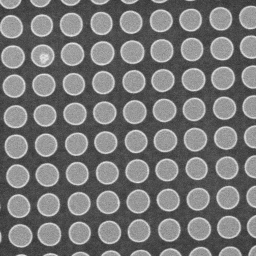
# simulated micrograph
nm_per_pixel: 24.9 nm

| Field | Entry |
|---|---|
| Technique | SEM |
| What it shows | an array of small figures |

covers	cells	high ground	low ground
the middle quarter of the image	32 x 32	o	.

................................
........................oo.....o
..o.....oooo...oooo...ooooo...oo
ooooo..ooooo...ooooo..ooooo...oo
ooooo..ooooo...ooooo..ooooo...oo
ooooo..ooooo...ooooo..ooooo...oo
ooooo...oooo....ooo....ooo.....o
.ooo............................
................................
.........oo.....ooo....oooo....o
.oooo...oooo...ooooo..oooooo..oo
ooooo..oooooo..ooooo..oooooo..oo
oooooo.oooooo..ooooo..oooooo..oo
ooooo...ooooo..ooooo...oooo....o
.oooo....ooo....ooo.............
................................
........................oo.....o
..oo.....ooo....oooo...ooooo..oo
.ooooo..ooooo..oooooo..ooooo..oo
oooooo..ooooo..oooooo.oooooo..oo
.ooooo..ooooo..oooooo..ooooo..oo
.oooo...oooo....oooo....ooo.....
..oo............................
................................
..........o......ooo....oooo...o
.oooo....oooo...ooooo..ooooo...o
.ooooo..oooooo.oooooo..ooooo...o
.ooooo..oooooo..ooooo..ooooo...o
.ooooo..ooooo...ooooo...oooo....
.oooo....ooo.....oo.............
................................
.........................oo.....